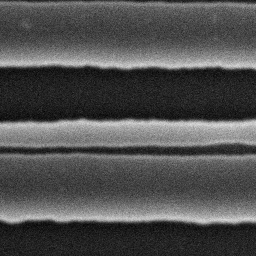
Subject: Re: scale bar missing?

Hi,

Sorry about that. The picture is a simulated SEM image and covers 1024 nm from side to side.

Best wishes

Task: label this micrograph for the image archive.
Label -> lines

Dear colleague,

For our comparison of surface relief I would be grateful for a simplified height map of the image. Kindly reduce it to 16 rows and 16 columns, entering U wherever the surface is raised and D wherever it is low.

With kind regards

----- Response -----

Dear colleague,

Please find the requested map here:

UUUUUUUUUUUUUUUU
UUUUUUUUUUUUUUUU
UUUUUUUUUUUUUUUU
UUUUUUUUUUUUUUUU
DDDDDDDDDDDDDDDD
DDDDDDDDDDDDDDDD
DDDDDDDDDDDDDDDD
DDDDDDDDDDDDDDDD
UUUUUUUUUUUUUUUU
UUUUUUUUUUUUUUUU
UUUUUUUUUUUUUUUU
UUUUUUUUUUUUUUUU
UUUUUUUUUUUUUUUU
UUUUUUUUUUUUUUUU
DDDDDDDDDDDDDDDD
DDDDDDDDDDDDDDDD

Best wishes